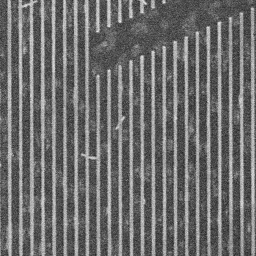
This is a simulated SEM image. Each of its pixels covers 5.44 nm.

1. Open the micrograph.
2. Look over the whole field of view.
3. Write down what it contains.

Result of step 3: parallel lines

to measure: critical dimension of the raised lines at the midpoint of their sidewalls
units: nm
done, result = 11.6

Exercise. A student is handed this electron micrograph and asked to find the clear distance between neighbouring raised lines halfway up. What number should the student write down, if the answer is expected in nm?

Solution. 48.3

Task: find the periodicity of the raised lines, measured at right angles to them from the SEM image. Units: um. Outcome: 0.0601